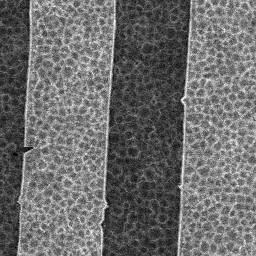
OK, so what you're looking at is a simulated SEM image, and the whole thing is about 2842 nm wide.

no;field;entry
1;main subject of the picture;one or a few lines or trenches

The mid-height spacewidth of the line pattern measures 855 nanometres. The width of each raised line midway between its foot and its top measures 910 nanometers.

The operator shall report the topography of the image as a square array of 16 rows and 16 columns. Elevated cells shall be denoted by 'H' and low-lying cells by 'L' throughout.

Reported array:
LLHHHHHLLLLLHHHH
LLHHHHHLLLLLHHHH
LLHHHHHLLLLLHHHH
LLHHHHHLLLLLHHHH
LLHHHHHLLLLLHHHH
LLHHHHHLLLLLHHHH
LLHHHHHLLLLLHHHH
LLHHHHHLLLLLHHHH
LLHHHHHLLLLLHHHH
LLHHHHHLLLLLHHHH
LLHHHHHLLLLHHHHH
LHHHHHHLLLLHHHHH
LHHHHHHLLLLHHHHH
LHHHHHLLLLLHHHHH
LHHHHHLLLLLHHHHH
LHHHHHLLLLLHHHHH